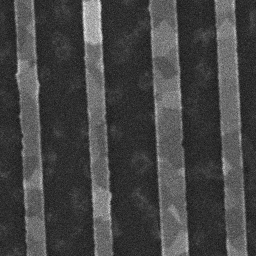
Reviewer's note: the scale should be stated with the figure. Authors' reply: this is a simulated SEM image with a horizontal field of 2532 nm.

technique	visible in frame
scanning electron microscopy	one or a few lines or trenches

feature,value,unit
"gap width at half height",486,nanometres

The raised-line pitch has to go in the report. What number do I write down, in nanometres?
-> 660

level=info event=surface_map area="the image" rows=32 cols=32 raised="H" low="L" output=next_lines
LLHHLLLLLLHHHLLLLLLHHHLLLLLHHLLL
LLHHLLLLLLHHHLLLLLLHHHLLLLLHHLLL
LLHHLLLLLLHHHLLLLLLHHHLLLLLHHLLL
LLHHLLLLLLLHHLLLLLLHHHLLLLLHHLLL
LLHHLLLLLLLHHLLLLLLHHHLLLLLHHLLL
LLHHLLLLLLLHHLLLLLLHHHLLLLLHHLLL
LLHHLLLLLLLHHLLLLLLHHHLLLLLHHHLL
LLHHHLLLLLLHHLLLLLLHHHLLLLLHHHLL
LLHHHLLLLLLHHLLLLLLHHHLLLLLHHHLL
LLHHHLLLLLLHHLLLLLLHHHLLLLLHHHLL
LLHHHLLLLLLHHLLLLLLHHHLLLLLHHHLL
LLHHHLLLLLLHHLLLLLLHHHHLLLLLHHLL
LLLHHLLLLLLHHLLLLLLHHHHLLLLLHHLL
LLLHHLLLLLLHHLLLLLLHHHHLLLLLHHLL
LLLHHLLLLLLHHLLLLLLHHHHLLLLLHHLL
LLLHHLLLLLLHHLLLLLLLHHHLLLLLHHLL
LLLHHLLLLLLHHLLLLLLLHHHLLLLLHHLL
LLLHHLLLLLLHHLLLLLLLHHHLLLLLHHLL
LLLHHLLLLLLHHLLLLLLLHHHLLLLLHHLL
LLLHHLLLLLLHHLLLLLLLHHHLLLLLHHLL
LLLHHLLLLLLHHLLLLLLLHHHLLLLLHHLL
LLLHHLLLLLLHHHLLLLLLHHHLLLLLHHLL
LLLHHLLLLLLLHHLLLLLLHHHLLLLLHHLL
LLLHHLLLLLLLHHLLLLLLHHHLLLLLHHLL
LLLHHLLLLLLLHHLLLLLLHHHLLLLLHHLL
LLLHHLLLLLLLHHLLLLLLHHHLLLLLHHLL
LLLHHLLLLLLLHHLLLLLLHHHLLLLLHHHL
LLLHHLLLLLLLHHLLLLLLHHHLLLLLHHHL
LLLHHHLLLLLLHHLLLLLLHHHLLLLLHHHL
LLLHHHLLLLLLHHLLLLLLHHHLLLLLHHHL
LLLHHHLLLLLLHHLLLLLLHHHHLLLLHHHL
LLLHHHLLLLLLHHLLLLLLHHHLLLLLLHHL